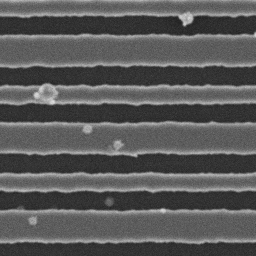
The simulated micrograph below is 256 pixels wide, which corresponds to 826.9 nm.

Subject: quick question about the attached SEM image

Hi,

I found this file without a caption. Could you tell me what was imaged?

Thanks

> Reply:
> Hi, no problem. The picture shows lines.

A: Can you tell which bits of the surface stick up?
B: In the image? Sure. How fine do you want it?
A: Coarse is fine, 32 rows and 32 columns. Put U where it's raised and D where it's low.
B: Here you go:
UUUUUUUUUUUUUUUUUUUUUUUUUUUUUUUU
UUUUUUUUUUUUUUUUUUUUUUUUUUUUUUUU
DDDDDDDDDDDDDDDDDDDDDDDUDDDDDDDD
DDDDDDDDDDDDDDDDDDDDDDDDDDDDDDDD
UUUUUUUUUUUUUUUUUUUUUUUUUUUUUUUU
UUUUUUUUUUUUUUUUUUUUUUUUUUUUUUUU
UUUUUUUUUUUUUUUUUUUUUUUUUUUUUUUU
UUUUUUUUUUUUUUUUUUUUUUUUUUUUUUUU
DDDDDDDDDDDDDDDDDDDDDDDDDDDDDDDD
DDDDDDDDDDDDDDDDDDDDDDDDDDDDDDDD
DDDDDUDDDDDDDDDDDDDDDDDDDDDDDDDD
UUUUUUUUUUUUUUUUUUUUUUUUUUUUUUUU
UUUUUUUUUUUUUUUUUUUUUUUUUUUUUUUU
DDDDDDDDDDDDDDDDDDDDDDDDDDDDDDDD
DDDDDDDDDDDDDDDDDDDDDDDDDDDDDDDD
UUUUUUUUUUUUUUUUUUUUUUUUUUUUUUUU
UUUUUUUUUUUUUUUUUUUUUUUUUUUUUUUU
UUUUUUUUUUUUUUUUUUUUUUUUUUUUUUUU
UUUUUUUUUUUUUUUUUUUUUUUUUUUUUUUU
DDDDDDDDDDDDDDDDDDDDDDDDDDDDDDDD
DDDDDDDDDDDDDDDDDDDDDDDDDDDDDDDD
DDDDDDDDDDDDDDDDDDDDDDDDDDDDDDDD
UUUUUUUUUUUUUUUUUUUUUUUUUUUUUUUU
UUUUUUUUUUUUUUUUUUUUUUUUUUUUUUUU
DDDDDDDDDDDDDDDDDDDDDDDDDDDDDDDD
DDDDDDDDDDDDDDDDDDDDDDDDDDDDDDDD
UUUUUUUUUUUUUUUUUUUUUUUUUUUUUUUU
UUUUUUUUUUUUUUUUUUUUUUUUUUUUUUUU
UUUUUUUUUUUUUUUUUUUUUUUUUUUUUUUU
UUUUUUUUUUUUUUUUUUUUUUUUUUUUUUUU
DDDDDDDDDDDDDDDDDDDDDDDDDDDDDDDD
DDDDDDDDDDDDDDDDDDDDDDDDDDDDDDDD